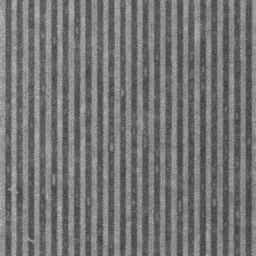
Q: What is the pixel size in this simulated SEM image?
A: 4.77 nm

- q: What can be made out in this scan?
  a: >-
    parallel lines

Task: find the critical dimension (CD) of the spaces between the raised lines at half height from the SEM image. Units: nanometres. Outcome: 35.1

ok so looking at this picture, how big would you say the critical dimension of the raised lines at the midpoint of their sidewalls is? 17.9 nm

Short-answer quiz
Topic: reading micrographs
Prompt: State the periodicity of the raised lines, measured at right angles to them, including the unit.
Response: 54.6 nm